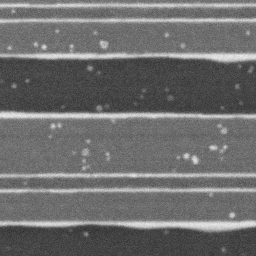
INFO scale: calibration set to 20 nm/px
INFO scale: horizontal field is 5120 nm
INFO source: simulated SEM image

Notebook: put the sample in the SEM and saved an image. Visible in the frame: lines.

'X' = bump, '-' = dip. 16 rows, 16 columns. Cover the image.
XXXXXXXXXXXXXXXX
XXXXXXXXXXXXXXXX
XXXXXXXXXXXXXXXX
-------------XX-
----------------
----------------
----------------
XXXXXXXXXXXXXXXX
XXXXXXXXXXXXXXXX
XXXXXXXXXXXXXXXX
XXXXXXXXXXXXXXXX
XXXXXXXXXXXXXXXX
XXXXXXXXXXXXXXXX
XXXXXXXXXXXXXXXX
----------------
----------------